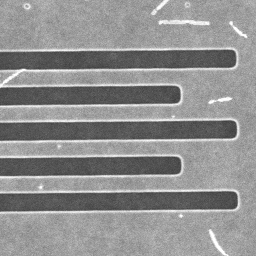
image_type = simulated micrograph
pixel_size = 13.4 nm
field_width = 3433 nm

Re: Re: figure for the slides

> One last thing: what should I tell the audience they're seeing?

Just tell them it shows groups of lines, slits or small figures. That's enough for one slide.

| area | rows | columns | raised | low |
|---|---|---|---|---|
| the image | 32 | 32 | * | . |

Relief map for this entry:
********************************
********************************
********************************
********************************
********************************
********************************
.............................***
..............................**
.............................***
********************************
********************************
.......................*********
.......................*********
********************************
********************************
.............................***
..............................**
........................********
********************************
********************************
.......................*********
.......................*********
********************************
********************************
..............................**
..............................**
********************************
********************************
********************************
********************************
********************************
********************************